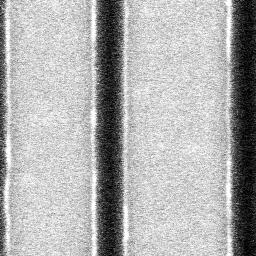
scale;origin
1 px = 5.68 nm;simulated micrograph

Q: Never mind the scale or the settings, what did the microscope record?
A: one or a few lines or trenches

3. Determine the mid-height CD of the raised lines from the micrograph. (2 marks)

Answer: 191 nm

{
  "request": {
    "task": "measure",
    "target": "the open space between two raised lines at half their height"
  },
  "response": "528 nm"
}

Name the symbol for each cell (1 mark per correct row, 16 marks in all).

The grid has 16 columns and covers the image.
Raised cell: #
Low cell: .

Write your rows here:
#.....##......##
......##......##
#.....##......##
#.....##......##
#.....##......##
#.....##......##
#.....##......##
#.....##......##
#.....##......##
#.....##......##
#.....##......##
......##......##
......##......##
......##......##
#.....##......##
......##......##